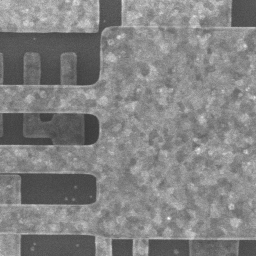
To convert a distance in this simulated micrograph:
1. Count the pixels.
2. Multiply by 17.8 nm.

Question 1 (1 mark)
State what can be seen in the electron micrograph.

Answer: wiring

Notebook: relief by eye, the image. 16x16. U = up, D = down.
DDDDDDDDDDDDDDDD
DDDDDDDDDDDDDDDD
DDDDDDUUUUUUUUUU
DDDDDDUUUUUUUUUU
DDDDDDUUUUUUUUUU
UUUUUUUUUUUUUUUU
UUUUUUUUUUUUUUUU
DDDDDDUUUUUUUUUU
DDDDDDUUUUUUUUUU
UUUUUUUUUUUUUUUU
UUUUUUUUUUUUUUUU
DDDDDDUUUUUUUUUU
DDDDDDUUUUUUUUUU
UUUUUUUUUUUUUUUU
UUUUUUUUUUUUUUUU
DDDDDDDDDDDDDDDD